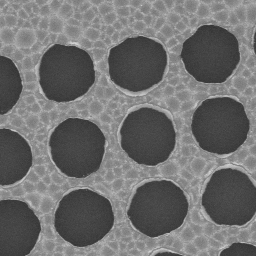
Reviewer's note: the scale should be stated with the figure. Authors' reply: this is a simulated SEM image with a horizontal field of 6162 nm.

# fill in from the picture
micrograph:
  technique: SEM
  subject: a regular array of holes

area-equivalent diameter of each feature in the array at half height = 1410 nm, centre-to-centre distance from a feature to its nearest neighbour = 1730 nanometres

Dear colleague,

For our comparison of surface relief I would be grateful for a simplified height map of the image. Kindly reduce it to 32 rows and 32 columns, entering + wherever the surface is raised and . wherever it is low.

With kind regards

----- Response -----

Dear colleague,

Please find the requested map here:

++++++++++++++++++++++++++++++++
++++++++++++++++++++++++++++++++
++++++++++++++++++++++++++++++++
+++++++++++++++++++++++++...++++
++++++++++++++++++++++++.....+++
+++++++++++++++.....+++.......++
++++++.....+++.......++.......++
.++++.......+........++.......++
..+++.......++.......++.......++
...++.......++.......+++.....+++
...++.......++......++++++++++++
...++......+++++..++++++++++++++
..++++...+++++++++++++++++...+++
..+++++++++++++++...+++++......+
++++++++++++++++.....+++.......+
++++++++....+++.......++.......+
..++++.......++.......++.......+
...+++.......++.......++.......+
....++.......++.......+++.....++
....++.......+++.....++++++.++++
....+++......++++...++++++++++++
...+++++....+++++++++++++++....+
...++++++++++++++++..+++++......
+++++++++++++++++......++.......
++++++++.....+++.......++.......
...++++.......++........+.......
....+++.......++.......++.......
.....++.......++.......+++.....+
.....++.......+++.....++++++++++
.....+++.....+++++..++++++++++++
....+++++...+++++++++++++++++..+
....++++++++++++++++.+++++++....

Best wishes